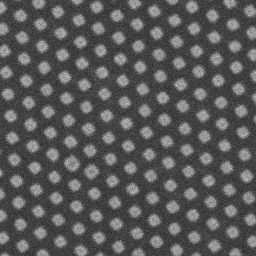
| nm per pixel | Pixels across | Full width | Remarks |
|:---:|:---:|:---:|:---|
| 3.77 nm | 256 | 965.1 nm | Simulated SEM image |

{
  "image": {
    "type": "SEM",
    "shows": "a regular array of raised bodies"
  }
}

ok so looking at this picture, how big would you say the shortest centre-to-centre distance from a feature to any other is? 81 nanometres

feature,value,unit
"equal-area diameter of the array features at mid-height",0.0399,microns